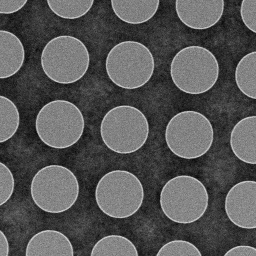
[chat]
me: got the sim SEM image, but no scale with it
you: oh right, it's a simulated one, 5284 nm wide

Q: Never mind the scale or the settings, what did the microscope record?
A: an array of small figures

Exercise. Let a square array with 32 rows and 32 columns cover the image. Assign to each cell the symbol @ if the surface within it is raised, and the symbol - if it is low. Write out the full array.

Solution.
@@@---@@@@@@--@@@@@@--@@@@@@--@@
@@-----@@@@---@@@@@---@@@@@@--@@
---------------@@@-----@@@@---@@
------------------------@@-----@
@@------------------------------
@@@---@@@@-----@@@--------------
@@@--@@@@@@---@@@@@---@@@@------
@@@--@@@@@@--@@@@@@---@@@@@---@@
@@---@@@@@@--@@@@@@--@@@@@@---@@
@-----@@@@----@@@@@--@@@@@@--@@@
--------------@@@@----@@@@@---@@
-----------------------@@-----@@
@-------------------------------
@@---@@@@@----@@@---------------
@@---@@@@@---@@@@@----@@@-------
@@---@@@@@---@@@@@---@@@@@----@@
@@---@@@@@---@@@@@@--@@@@@@--@@@
@----@@@@@---@@@@@---@@@@@@--@@@
-------@------@@@----@@@@@---@@@
----------------------@@@-----@@
--------------------------------
@----@@@@-----@@----------------
@@--@@@@@@---@@@@----@@@@-------
@@--@@@@@@--@@@@@@--@@@@@@---@@@
@---@@@@@@--@@@@@@--@@@@@@--@@@@
-----@@@@---@@@@@@--@@@@@@--@@@@
------@------@@@@---@@@@@@--@@@@
----------------------@@-----@@@
--------------------------------
@---@@@@------@-----------------
@---@@@@@---@@@@@----@@@--------
@--@@@@@@---@@@@@---@@@@@---@@@@